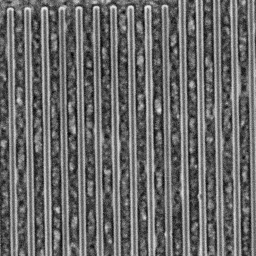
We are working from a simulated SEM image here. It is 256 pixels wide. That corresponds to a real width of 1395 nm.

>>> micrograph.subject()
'parallel lines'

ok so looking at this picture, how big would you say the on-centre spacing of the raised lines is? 93.7 nanometres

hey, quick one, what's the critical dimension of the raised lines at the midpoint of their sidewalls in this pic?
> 32 nanometres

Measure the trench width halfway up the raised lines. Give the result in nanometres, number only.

64